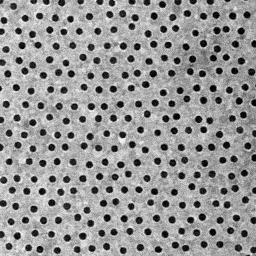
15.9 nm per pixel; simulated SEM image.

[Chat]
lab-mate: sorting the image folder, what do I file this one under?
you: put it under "a regular array of holes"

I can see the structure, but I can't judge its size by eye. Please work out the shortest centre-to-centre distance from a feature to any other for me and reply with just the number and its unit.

216 nm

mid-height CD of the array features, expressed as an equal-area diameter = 124 nm